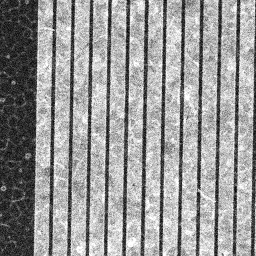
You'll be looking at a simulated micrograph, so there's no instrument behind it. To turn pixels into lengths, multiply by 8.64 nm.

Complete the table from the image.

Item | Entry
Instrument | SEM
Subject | parallel lines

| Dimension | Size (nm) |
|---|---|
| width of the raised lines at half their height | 121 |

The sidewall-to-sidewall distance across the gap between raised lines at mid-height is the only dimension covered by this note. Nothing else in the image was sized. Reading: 36.7 nm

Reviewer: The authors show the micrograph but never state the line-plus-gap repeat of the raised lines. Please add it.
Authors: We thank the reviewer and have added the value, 0.159 microns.